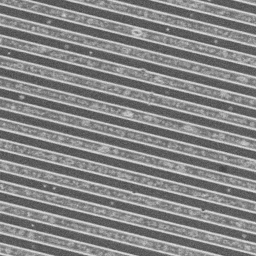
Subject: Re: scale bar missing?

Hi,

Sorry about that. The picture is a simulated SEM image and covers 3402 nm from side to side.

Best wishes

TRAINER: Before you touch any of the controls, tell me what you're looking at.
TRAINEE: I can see parallel lines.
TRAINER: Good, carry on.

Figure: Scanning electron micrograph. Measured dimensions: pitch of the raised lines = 20.2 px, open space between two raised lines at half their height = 131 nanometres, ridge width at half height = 132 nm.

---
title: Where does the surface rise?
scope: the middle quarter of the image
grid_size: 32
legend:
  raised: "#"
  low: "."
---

.....##########...........######
.........###########..........##
##...........##########.........
######...........##########.....
##########...........##########.
....##########...........#######
........##########...........###
#...........###########.........
#####............##########.....
#########............##########.
...##########............#######
.......##########............###
...........##########...........
#####..........##########.......
#########..........##########...
...##########..........#########
.......##########..........#####
...........##########..........#
###............##########.......
#######............##########...
.##########............#########
.....##########............#####
.........##########............#
###..........##########.........
#######..........##########.....
.##########..........##########.
.....##########..........#######
.........##########...........##
##...........##########.........
#####............##########.....
#########............##########.
.....#########...........#######